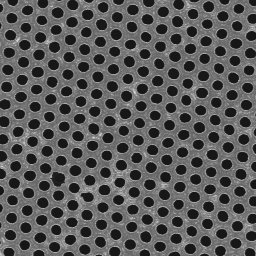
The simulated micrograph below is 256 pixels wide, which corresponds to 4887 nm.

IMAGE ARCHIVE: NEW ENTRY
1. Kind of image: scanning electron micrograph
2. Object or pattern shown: a regular array of holes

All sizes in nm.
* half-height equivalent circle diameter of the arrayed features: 204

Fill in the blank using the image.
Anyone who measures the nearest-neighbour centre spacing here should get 0.326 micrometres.